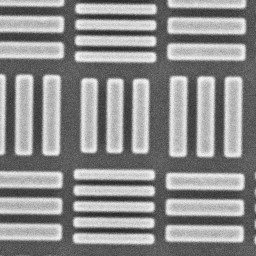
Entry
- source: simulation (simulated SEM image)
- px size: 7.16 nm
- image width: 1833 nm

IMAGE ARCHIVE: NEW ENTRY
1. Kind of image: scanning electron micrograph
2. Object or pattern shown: groups of lines, slits or small figures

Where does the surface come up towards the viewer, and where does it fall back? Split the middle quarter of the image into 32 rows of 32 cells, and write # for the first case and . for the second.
................................
................................
................................
...........................###..
.....###...####..####......####.
.....###...####..####......####.
.....###...####..####......####.
.....###...####..####......####.
.....###...####..####......####.
.....###...####..####......####.
.....###...####..####......####.
.....###...###...####......####.
.....###...###...####......####.
.....###...###...####......####.
.....###...###...####......####.
.....###...###...####......####.
.....###...###...####......####.
.....###...###...####......###..
.....###...###...####......###..
.....###...###...####......###..
.....###...###...####.....####..
.....###...###...####.....####..
..........................####..
................................
................................
................................
................................
...####################...######
...####################...######
..........................######
...###....................######
...####################.........